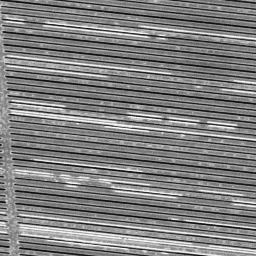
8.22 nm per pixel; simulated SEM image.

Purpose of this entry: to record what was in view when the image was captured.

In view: parallel lines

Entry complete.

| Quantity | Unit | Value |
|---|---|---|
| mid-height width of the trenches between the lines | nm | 15.3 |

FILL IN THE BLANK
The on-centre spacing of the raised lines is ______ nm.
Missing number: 51.6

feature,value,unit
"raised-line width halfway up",38.8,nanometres